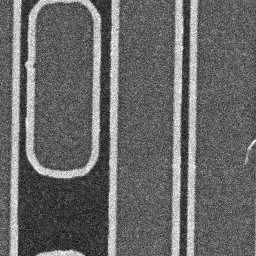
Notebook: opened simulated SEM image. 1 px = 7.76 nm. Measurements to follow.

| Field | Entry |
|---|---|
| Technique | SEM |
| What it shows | one or a few lines or trenches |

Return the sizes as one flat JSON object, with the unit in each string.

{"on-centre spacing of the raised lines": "625 nanometres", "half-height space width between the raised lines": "0.493 microns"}